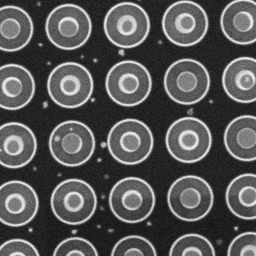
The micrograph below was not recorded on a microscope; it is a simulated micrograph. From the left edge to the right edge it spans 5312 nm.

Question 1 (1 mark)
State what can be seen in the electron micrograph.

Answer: an array of small figures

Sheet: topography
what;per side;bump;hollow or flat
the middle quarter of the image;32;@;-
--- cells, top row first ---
----@@@@@@@@@------@@@@@@@@-----
-----@@@@@@@--------@@@@@@------
------@@@@@----------@@@@@---@@@
-------@@@@----@@@---@@@@---@@@@
@@@----@@@@---@@@@----@@@---@@@@
@@@----@@@@----@@@---@@@@----@@@
@@@----@@@@----@@@---@@@@@----@@
------@@@@@----------@@@@@------
------@@@@@@--------@@@@@@@-----
-----@@@@@@@@------@@@@@@@@@@---
---@@@@@@@@@@@@@@@@@@@@@@@@@@@@@
@@@@@@@@@@@@@@@@@@@@@@@@@@@@@@@@
@@@@@@@@@@@@@@@@@@@@@@@@@@@@@@@@
@@@@@@@@@@@@@@@@@@@@@@@@@@@@@@--
@-@@@@@@@@@@@@-----@@@@@@@@@----
-----@@@@@@@@-------@@@@@@@-----
------@@@@@@---------@@@@@------
-------@@@@-----@-----@@@@----@@
@@@@---@@@@----@@@@---@@@@---@@@
@@@@----@@@----@@@@---@@@@---@@@
@@@@---@@@@----@@@@---@@@@----@@
@@@@---@@@@@----@@----@@@@------
-------@@@@@---------@@@@@@-----
------@@@@@@@-------@@@@@@@@----
-----@@@@@@@@@----@@@@@@@@@@@@@-
@@@@@@@@@@@@@@@@@@@@@@@@@@@@@@@@
@@@@@@@@@@@@@@@@@@@@@@@@@@@@@@@@
@@@@@@@@@@@@@@@@@@@@@@@@@@@@@@@@
@@@@@@@@@@@@@@@@@@@@@@@@@@@@@@--
-----@@@@@@@@@------@@@@@@@@----
------@@@@@@@--------@@@@@@-----
-------@@@@@----------@@@@@---@@